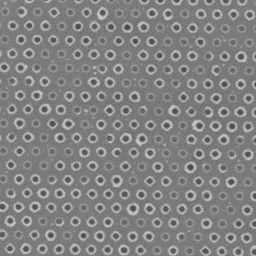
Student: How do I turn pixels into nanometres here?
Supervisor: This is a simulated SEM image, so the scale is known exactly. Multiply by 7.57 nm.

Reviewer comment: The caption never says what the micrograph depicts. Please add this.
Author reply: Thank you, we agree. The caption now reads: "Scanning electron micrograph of a regular array of holes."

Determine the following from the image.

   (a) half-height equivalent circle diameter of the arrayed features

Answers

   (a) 0.0452 microns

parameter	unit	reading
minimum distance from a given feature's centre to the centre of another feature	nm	119